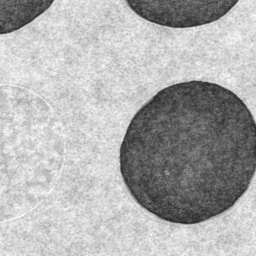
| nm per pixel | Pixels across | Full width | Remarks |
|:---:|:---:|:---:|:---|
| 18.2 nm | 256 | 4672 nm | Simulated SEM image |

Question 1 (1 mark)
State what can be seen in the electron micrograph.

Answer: holes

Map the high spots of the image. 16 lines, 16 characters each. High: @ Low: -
---@@@@@------@@
--@@@@@@@@---@@@
@@@@@@@@@@@@@@@@
@@@@@@@@@@@@@@@@
@@@@@@@@@@@@@@@@
@@@@@@@@@@----@@
@@@@@@@@@------@
@@@@@@@@--------
@@@@@@@@--------
@@@@@@@@--------
@@@@@@@@--------
@@@@@@@@--------
@@@@@@@@-------@
@@@@@@@@@@----@@
@@@@@@@@@@@@@@@@
@@@@@@@@@@@@@@@@